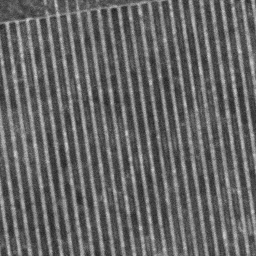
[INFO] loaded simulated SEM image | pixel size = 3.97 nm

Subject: parallel lines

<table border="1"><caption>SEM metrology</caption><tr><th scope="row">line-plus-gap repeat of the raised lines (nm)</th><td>40.8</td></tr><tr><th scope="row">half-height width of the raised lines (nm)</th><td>7.4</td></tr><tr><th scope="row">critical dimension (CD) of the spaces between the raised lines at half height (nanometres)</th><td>33.3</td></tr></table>